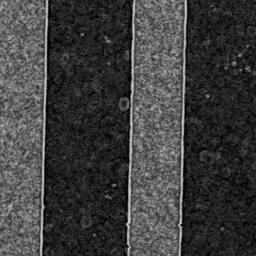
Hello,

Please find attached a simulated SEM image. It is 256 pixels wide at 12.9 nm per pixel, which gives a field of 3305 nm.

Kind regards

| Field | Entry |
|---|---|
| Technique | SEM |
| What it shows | one or a few lines or trenches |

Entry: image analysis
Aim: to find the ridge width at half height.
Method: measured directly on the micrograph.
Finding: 679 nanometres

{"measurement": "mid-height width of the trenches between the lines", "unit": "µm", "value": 1.11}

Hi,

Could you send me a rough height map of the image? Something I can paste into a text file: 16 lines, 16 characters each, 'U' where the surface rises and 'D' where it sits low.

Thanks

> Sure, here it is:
UUUDDDDDUUUUDDDD
UUUDDDDDUUUUDDDD
UUUDDDDDUUUUDDDD
UUUDDDDDUUUUDDDD
UUUDDDDDUUUUDDDD
UUUDDDDDUUUDDDDD
UUUDDDDDUUUDDDDD
UUUDDDDDUUUDDDDD
UUUDDDDDUUUDDDDD
UUUDDDDDUUUDDDDD
UUUDDDDDUUUDDDDD
UUUDDDDDUUUDDDDD
UUUDDDDDUUUDDDDD
UUUDDDDDUUUDDDDD
UUUDDDDDUUUDDDDD
UUUDDDDDUUUDDDDD